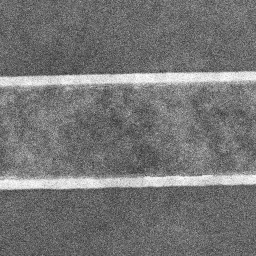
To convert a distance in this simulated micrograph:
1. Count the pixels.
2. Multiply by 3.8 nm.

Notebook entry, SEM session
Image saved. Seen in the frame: one or a few lines or trenches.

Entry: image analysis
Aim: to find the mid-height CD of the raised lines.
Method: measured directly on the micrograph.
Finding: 396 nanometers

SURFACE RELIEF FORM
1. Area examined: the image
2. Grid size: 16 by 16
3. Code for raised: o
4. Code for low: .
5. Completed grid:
................
................
................
................
................
oooooooooooooooo
oooooooooooooooo
oooooooooooooooo
oooooooooooooooo
oooooooooooooooo
oooooooooooooooo
ooo.............
................
................
................
................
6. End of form